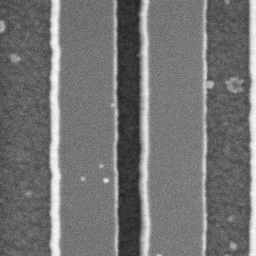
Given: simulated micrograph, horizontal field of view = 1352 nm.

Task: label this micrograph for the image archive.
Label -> lines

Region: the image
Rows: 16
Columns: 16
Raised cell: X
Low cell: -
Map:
---XXXX--XXXX---
---XXXX--XXXX---
---XXXX--XXXX---
---XXXX--XXXX---
---XXXX--XXXX---
---XXXX--XXXX---
---XXXX--XXXX---
---XXXX--XXXX---
---XXXX--XXXX---
---XXXX--XXXX---
---XXXX--XXXX---
---XXXX--XXXX---
---XXXX--XXXX---
---XXXX--XXXX---
---XXXX--XXXX---
---XXXX--XXXX---